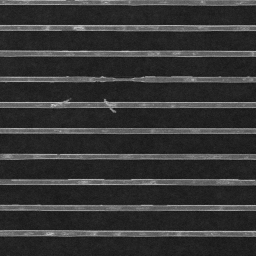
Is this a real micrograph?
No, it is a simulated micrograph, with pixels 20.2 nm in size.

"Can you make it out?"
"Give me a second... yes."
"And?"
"parallel lines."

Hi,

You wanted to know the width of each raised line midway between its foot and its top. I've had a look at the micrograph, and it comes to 104 nm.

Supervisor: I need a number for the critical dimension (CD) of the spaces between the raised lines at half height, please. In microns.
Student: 0.415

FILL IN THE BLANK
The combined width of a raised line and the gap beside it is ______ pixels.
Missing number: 25.6